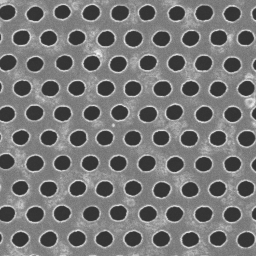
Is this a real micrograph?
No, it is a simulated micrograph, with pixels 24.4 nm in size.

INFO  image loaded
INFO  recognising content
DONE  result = a regular array of holes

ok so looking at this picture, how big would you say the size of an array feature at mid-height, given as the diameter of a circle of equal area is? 0.391 µm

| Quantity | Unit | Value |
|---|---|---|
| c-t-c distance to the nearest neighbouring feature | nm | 670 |